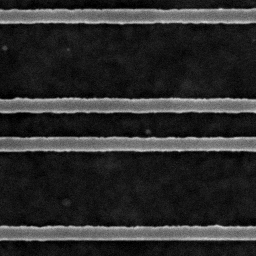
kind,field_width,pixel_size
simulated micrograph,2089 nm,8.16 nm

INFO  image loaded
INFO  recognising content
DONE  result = lines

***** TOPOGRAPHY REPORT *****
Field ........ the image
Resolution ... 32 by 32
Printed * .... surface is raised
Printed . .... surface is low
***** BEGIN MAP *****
................................
********************************
********************************
................................
................................
................................
................................
................................
................................
................................
................................
................................
.******************************.
********************************
................................
................................
................................
********************************
********************************
................................
................................
................................
................................
................................
................................
................................
................................
................................
********************************
********************************
................................
................................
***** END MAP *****